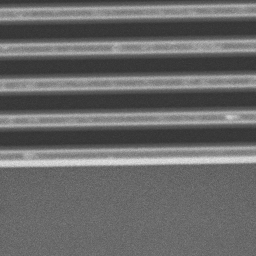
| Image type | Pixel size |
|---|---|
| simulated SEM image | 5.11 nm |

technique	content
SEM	parallel lines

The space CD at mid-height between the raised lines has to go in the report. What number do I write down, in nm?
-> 107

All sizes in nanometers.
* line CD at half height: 75.3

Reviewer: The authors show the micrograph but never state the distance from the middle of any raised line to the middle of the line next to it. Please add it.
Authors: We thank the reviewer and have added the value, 0.182 micrometres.